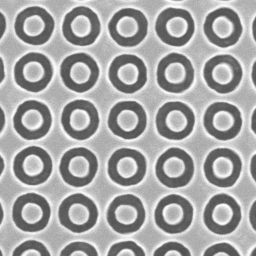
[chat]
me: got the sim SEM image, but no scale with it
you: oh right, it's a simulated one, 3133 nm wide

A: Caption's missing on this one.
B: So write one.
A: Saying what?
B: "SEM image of a regular array of ring-shaped grooves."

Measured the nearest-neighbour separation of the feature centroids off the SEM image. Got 561 nanometres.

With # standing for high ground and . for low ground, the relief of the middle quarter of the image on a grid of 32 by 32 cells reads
..####..###....###..###...####..
..####...##...####...##..#####..
..####...##...#####..##..#####..
..####...##...####...##...####..
...##...####...###...##...###...
........####........####........
##....#######......######......#
################.###########.###
################################
#......######.....########...###
........####.......#####.......#
...##...####........###.........
..####...##...####...##...####..
..####...##..#####...##...####..
..####...##..#####...##...#####.
..####...##...####...##...####..
........###....##...###....##...
#.......####.......#####.......#
##....########....#######.....##
################################
################################
#.....#######.....########....##
........####........####.......#
...##...###....#....####...#....
.#####..###...####...##..#####..
.#####...##..#####...##..#####..
.#####..###...####...##..#####..
..####..###...###...###...###...
.......####.........###.........
.......#####.......#####.......#
##...##########.#########......#
################################